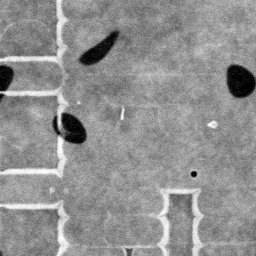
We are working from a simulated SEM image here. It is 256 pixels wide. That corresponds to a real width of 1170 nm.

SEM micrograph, wiring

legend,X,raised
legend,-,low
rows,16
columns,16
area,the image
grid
----XXXXXXXXXXXX
----XXXXXXXXXXXX
----XXXXXXXXXXXX
---XXXXXXXXXXXXX
XXXXXXXXXXXXXXXX
XXXXXXXXXXXXXXXX
----XXXXXXXXXXXX
----XXXXXXXXXXXX
----XXXXXXXXXXXX
----XXXXXXXXXXXX
----XXXXXXXXXXXX
XXXXXXXXXXXXXXXX
XXXXXXXXXX--XXXX
----XXXXXX--XXXX
----XXXXXX--XXXX
----XXXXXX--XXXX